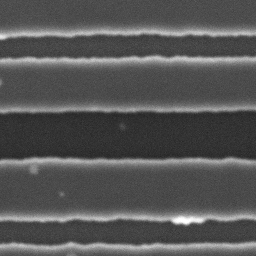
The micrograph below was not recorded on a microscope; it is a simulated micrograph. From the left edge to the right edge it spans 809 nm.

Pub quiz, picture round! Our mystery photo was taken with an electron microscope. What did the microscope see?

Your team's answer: lines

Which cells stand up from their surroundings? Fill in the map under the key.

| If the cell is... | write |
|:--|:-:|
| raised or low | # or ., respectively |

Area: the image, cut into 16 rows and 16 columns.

################
################
################
################
################
################
################
................
................
................
################
################
################
################
################
################